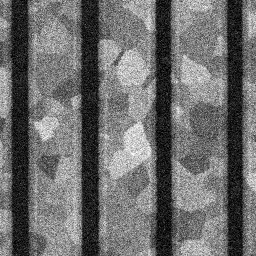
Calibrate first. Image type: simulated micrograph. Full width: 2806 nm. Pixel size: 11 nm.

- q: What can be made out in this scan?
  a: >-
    one or a few lines or trenches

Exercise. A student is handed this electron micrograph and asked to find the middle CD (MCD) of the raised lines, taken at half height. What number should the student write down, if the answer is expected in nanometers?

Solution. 523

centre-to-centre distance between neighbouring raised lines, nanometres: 790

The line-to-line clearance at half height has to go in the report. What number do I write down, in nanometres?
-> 267